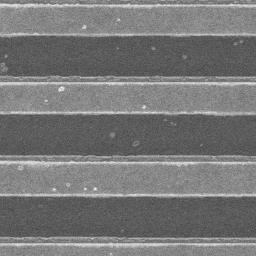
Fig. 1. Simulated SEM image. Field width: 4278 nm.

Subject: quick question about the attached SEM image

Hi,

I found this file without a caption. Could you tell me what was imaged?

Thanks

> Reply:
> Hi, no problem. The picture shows lines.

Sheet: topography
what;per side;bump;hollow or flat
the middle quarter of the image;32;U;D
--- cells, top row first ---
DDDDDDDDDDDDDDDDDDDDDDDDDDDDDDDD
DDDDDDDDDDDDDDDDDDDDDDDDDDDDDDDD
DDDDDDDDDDDDDDDDDDDDDDDDDDDDDDDD
UUUUUUUUUUUUUUUDUUUUUUUUUDDDDUUU
UUUUUUUUUUUUUUUUUUUUUUUUUUUUUUUU
UUUUUUUUUUUUUUUUUUUUUUUUUUUUUUUU
UUUUUUUUUUUUUUUUUUUUUUUUUUUUUUUU
UUUUUUUUUUUUUUUUUUUUUUUUUUUUUUUU
UUUUUUUUUUUUUUUUUUUUUUUUUUUUUUUU
UUUUUUUUUUUUUUUUUUUUUUUUUUUUUUUU
UUUUUUUUUUUUUUUUUUUUUUUUUUUUUUUU
UUUUUUUUUUUUUUUUUUUUUUUUUUUUUUUU
DDDDDDDDDDDDDDDDDDDDDDDDDDDDDDDD
DDDDDDDDDDDDDDDDDDDDDDDDDDDDDDDD
DDDDDDDDDDDDDDDDDDDDDDDDDDDDDDDD
DDDDDDDDDDDDDDDDDDDDDDDDDDDDDDDD
DDDDDDDDDDDDDDDDDDDDDDDDDDDDDDDD
DDDDDDDDDDDDDDDDDDDDDDDDDDDDDDDD
DDDDDDDDDDDDDDDDDDDDDDDDDDDDDDDD
DDDDDDDDDDDDDDDDDDDDDDDDDDDDDDDD
DDDDDDDDDDDDDDDDDDDDDDDDDDDDDDDD
DDDDDDDDDDDDDDDDDDDDDDDDDDDDDDDD
DDDDDDDDDDDDDDDDDDDDDDDDDDDDDDDD
UUUUUUUUUUUUUUUUUUUUUUUUUUUUUUUU
UUUUUUUUUUUUUUUUUUUUUUUUUUUUUUUU
UUUUUUUUUUUUUUUUUUUUUUUUUUUUUUUU
UUUUUUUUUUUUUUUUUUUUUUUUUUUUUUUU
UUUUUUUUUUUUUUUUUUUUUUUUUUUUUUUU
UUUUUUUUUUUUUUUUUUUUUUUUUUUUUUUU
UUUUUUUUUUUUUUUUUUUUUUUUUUUUUUUU
UUUUUUUUUUUUUUUUUUUUUUUUUUUUUUUU
UUUUUUUUUUUUUUUUUUUUUUUUUUUUUUUU